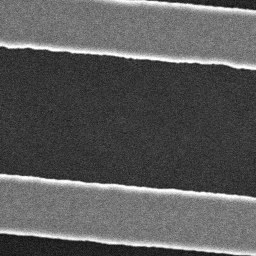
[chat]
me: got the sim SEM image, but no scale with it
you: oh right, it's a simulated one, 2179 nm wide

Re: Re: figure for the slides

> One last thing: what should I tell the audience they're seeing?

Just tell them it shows lines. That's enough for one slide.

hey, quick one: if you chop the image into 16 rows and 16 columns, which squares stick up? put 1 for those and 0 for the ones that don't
1111111111111100
1111111111111111
1111111111111111
0000000111111111
0000000000000000
0000000000000000
0000000000000000
0000000000000000
0000000000000000
0000000000000000
0000000000000000
1111111000000000
1111111111111111
1111111111111111
1111111111111111
0000000000011111